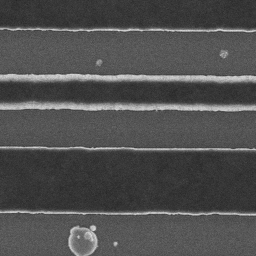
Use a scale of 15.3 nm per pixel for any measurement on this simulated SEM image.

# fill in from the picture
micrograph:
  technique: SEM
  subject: lines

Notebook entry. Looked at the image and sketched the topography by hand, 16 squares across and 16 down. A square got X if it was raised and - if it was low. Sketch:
XXXXXXXXXXXXXXXX
XXXXXXXXXXXXXXXX
----------------
----------------
----------------
XXXXXXXXXXXXXXXX
XXXXXXXXXXXXXXXX
----------------
----------------
XXXXXXXXXXXXXXXX
XXXXXXXXXXXXXXXX
XXXXXXXXXXXXXXXX
XXXXXXXXXXXXXXXX
----------------
----------------
----------------